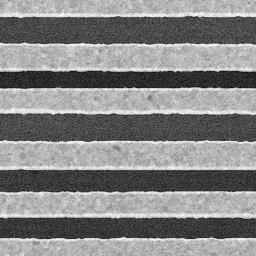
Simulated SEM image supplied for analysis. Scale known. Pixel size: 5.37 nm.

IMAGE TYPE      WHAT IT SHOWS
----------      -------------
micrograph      lines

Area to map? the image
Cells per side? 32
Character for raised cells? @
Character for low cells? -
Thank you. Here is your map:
@@@@@@@@@@@@@@@@@@@@@@@@@@@@@@@@
@@@@@@@@@@@@@@@@@@@@@@@@@@@@@@@@
--------------------------------
--------------------------------
--------------------------------
@-@@------@------------@--------
@@@@@@@@@@@@@@@@@@@@@@@@@@@@@@@@
@@@@@@@@@@@@@@@@@@@@@@@@@@@@@@@@
@@@@@@@@@@@@@@@@@@@@@@@@@@@@@@@@
--------------------------------
--------------------------------
@@@@@@@@@@@@@@@@@@@@@@@@@@@@@@@@
@@@@@@@@@@@@@@@@@@@@@@@@@@@@@@@@
@@@@@@@@@@@@@@@@@@@@@@@@@@@@@@@@
--------------------------------
--------------------------------
--------------------------------
--------------------------------
@@@@@@@@@@@@@@@@@@@@@@@@@@@@@@@@
@@@@@@@@@@@@@@@@@@@@@@@@@@@@@@@@
@@@@@@@@@@@@@@@@@@@@@@@@@@@@@@@@
--------------------------------
--------------------------------
--------------------------------
@@@@@@@@@@@@@@@@@@@@@@@@@@@@@@@@
@@@@@@@@@@@@@@@@@@@@@@@@@@@@@@@@
@@@@@@@@@@@@@@@@@@@@@@@@@@@@@@@@
--------------------------------
--------------------------------
--------------------------------
@@@@@@@@@@@@@@@@@@@@@@@@@@@@@@@@
@@@@@@@@@@@@@@@@@@@@@@@@@@@@@@@@